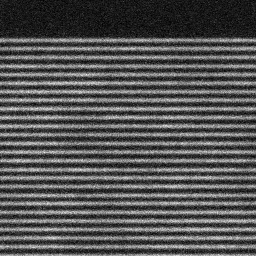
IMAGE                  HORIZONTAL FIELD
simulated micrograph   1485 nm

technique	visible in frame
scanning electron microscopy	parallel lines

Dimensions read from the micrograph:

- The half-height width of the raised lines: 13 nm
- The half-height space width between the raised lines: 34.8 nm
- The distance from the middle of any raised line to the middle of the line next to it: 49.8 nanometers